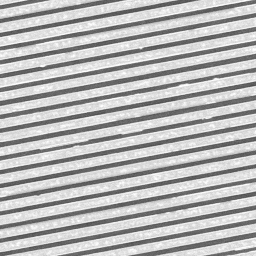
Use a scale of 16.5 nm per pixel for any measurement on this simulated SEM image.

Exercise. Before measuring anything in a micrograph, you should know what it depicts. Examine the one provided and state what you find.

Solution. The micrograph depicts parallel lines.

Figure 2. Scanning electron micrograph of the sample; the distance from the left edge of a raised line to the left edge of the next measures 0.222 um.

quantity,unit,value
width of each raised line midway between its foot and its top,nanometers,136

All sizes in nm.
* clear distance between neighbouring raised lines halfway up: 75